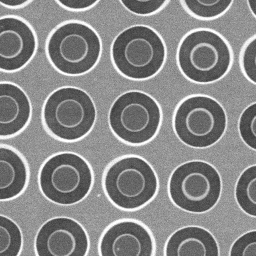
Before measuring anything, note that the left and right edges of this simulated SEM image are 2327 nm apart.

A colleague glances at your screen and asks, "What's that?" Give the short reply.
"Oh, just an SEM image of an array of small figures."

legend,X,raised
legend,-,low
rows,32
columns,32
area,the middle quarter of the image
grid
-------XXXXXX------X-----XXXX---
------XXXXXXXX----------XXXXX---
X---XXXXXXXXXX---------XXXXXXX--
XXXXXXXXXXXXXXXXX----XXXXXXXXXX-
XXXXXXXXXXXXXXXXXXXXXXXXXXXXXXXX
XXXXXXXXXXXXXXXXXXXXXXXXXXXXXXXX
----XXXXXXXXXXXXXXXXXXXXXXXXXXXX
------XXXXXXXXX------XXXXXXXXXXX
------XXXXXXXX--------XXXXXXXXX-
XXX----XXXXXX----------XXXXXX---
XXXX----XXXX----XXX-----XXXXX---
XXXXX---XXXX---XXXXXX---XXXX----
XXXXX---XXX----XXXXXX---XXXX---X
XXXXX---XXX---XXXXXXX---XXXX---X
XXXX---XXXX----XXXXXX---XXX----X
XXX----XXXXX---XXXXXX---XXX----X
-------XXXXX----XXX----XXXXX---X
------XXXXXXX----------XXXXX----
----XXXXXXXXXX--------XXXXXXX---
XXXXXXXXXXXXXXX------XXXXXXXXX--
XXXXXXXXXXXXXXXXXXXXXXXXXXXXXXXX
XXXXXXXXXXXXXXXXXXXXXXXXXXXXXXXX
--XXXXXXXXXXXXXXXXXXXXXXXXXXXXXX
----XXXXXXXXXXX----XXXXXXXXXXXXX
-----XXXXXXXX--------XXXXXXXXXX-
------XXXXXX----------XXXXXXX---
XXX----XXXX-----X-----XXXXXX----
XXXX---XXX----XXXXX----XXXX-----
XXXX---XXX----XXXXXX---XXXX---XX
XXXX---XXX---XXXXXXX---XXX----XX
XXX----XXX---XXXXXXX---XXX----XX
XX----XXXX----XXXXXX---XXX----XX